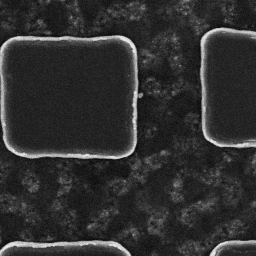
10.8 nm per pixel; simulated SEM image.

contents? raised bodies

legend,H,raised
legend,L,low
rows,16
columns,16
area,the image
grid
LLLLLLLLLLLLLLLL
LLLLLLLLLLLLLLLL
LHHHHHHHLLLLLHHH
HHHHHHHHLLLLLHHH
HHHHHHHHHLLLLHHH
HHHHHHHHHLLLLHHH
HHHHHHHHLLLLLHHH
HHHHHHHHLLLLLHHH
HHHHHHHHLLLLLHHH
LHHHHHHHLLLLLLLL
LLLLLLLLLLLLLLLL
LLLLLLLLLLLLLLLL
LLLLLLLLLLLLLLLL
LLLLLLLLLLLLLLLL
LLLLLLLLLLLLLLLL
HHHHHHHHLLLLLLHH